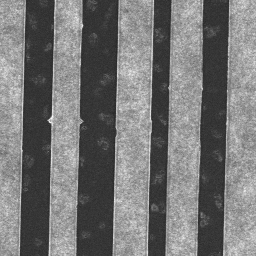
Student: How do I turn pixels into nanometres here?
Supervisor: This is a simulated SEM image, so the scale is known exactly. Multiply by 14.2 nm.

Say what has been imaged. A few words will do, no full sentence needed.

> one or a few lines or trenches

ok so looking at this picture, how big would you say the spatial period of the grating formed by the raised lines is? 846 nm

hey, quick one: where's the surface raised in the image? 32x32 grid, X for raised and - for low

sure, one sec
XXX----XXX-----XXXX--XXXX----XXX
XXX----XXX-----XXXX--XXXX----XXX
XXX----XXX-----XXXX--XXXX----XXX
XXX----XXX-----XXXX--XXXX----XXX
XXX----XXX-----XXXX--XXXX----XXX
XXX----XXX-----XXXX--XXXX----XXX
XXX----XXX-----XXXX--XXXX----XXX
XXX----XXX-----XXXX--XXXX----XXX
XXX----XXX-----XXXX--XXXX----XXX
XXX----XXX-----XXXX--XXXX----XXX
XXX----XXX-----XXXX--XXXX---XXXX
XXX----XXX-----XXXX--XXXX---XXXX
XXX----XXX-----XXXX--XXXX---XXXX
XXX----XXX-----XXXX--XXXX---XXXX
XXX---XXXX-----XXXX--XXXX---XXXX
XXX---XXXX-----XXXX--XXXX---XXXX
XXX---XXXX-----XXXX--XXXX---XXXX
XXX---XXXX-----XXXX--XXXX---XXXX
XXX----XXX----XXXXX--XXXX---XXXX
XXX----XXX----XXXXX--XXXX---XXXX
XXX---XXXX----XXXXX--XXXX---XXXX
XXX---XXXX----XXXXX--XXXX---XXXX
XXX---XXXX----XXXXX--XXXX---XXXX
XXX---XXXX----XXXXX--XXXX---XXXX
XXX---XXXX----XXXXX--XXXX---XXXX
XXX---XXXX----XXXXX--XXXX---XXXX
XXX---XXXX----XXXXX--XXXX---XXXX
XXX---XXXX----XXXXX--XXXX---XXXX
XX----XXXX----XXXX---XXXX---XXXX
XX----XXXX----XXXX---XXXX---XXXX
XX----XXXX----XXXX---XXXX---XXXX
XX----XXX-----XXXX---XXXX---XXXX